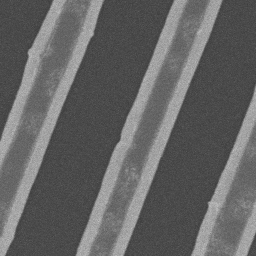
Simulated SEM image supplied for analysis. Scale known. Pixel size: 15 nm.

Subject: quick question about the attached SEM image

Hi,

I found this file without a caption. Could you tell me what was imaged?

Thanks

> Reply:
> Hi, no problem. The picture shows one or a few lines or trenches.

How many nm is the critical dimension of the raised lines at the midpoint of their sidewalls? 503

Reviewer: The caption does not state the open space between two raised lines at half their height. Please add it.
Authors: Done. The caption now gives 1140 nm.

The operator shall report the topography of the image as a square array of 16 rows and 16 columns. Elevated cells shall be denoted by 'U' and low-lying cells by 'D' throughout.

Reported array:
DDDDUUDDDDDUUDDD
DDDUUUDDDDDUUDDD
DDDUUDDDDDUUUDDD
DDUUUDDDDDUUDDDD
DDUUDDDDDDUUDDDD
DDUUDDDDDUUDDDDD
DUUUDDDDDUUDDDDD
DUUDDDDDUUUDDDDD
DUUDDDDDUUDDDDDU
UUDDDDDDUUDDDDDU
UUDDDDDUUDDDDDUU
UUDDDDDUUDDDDDUU
UDDDDDUUUDDDDDUU
UDDDDDUUDDDDDUUU
UDDDDDUUDDDDDUUU
DDDDDUUDDDDDDUUD